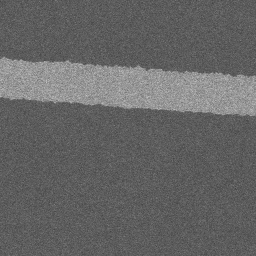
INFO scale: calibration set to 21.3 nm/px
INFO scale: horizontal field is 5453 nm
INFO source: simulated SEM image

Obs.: one or a few lines or trenches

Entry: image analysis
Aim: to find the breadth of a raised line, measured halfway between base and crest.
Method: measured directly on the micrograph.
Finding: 812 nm